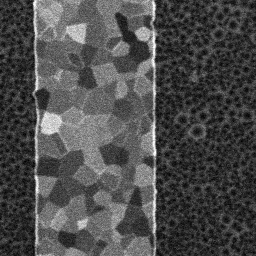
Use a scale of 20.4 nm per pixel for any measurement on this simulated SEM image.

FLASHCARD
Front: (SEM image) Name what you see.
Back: one or a few lines or trenches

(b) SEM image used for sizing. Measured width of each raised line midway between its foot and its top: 2.41 microns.